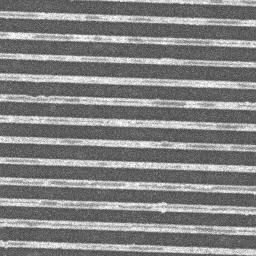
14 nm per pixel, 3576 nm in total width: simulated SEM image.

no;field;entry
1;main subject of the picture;parallel lines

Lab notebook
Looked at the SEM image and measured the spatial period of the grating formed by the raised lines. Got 291 nm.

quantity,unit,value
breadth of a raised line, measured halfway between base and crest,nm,71.6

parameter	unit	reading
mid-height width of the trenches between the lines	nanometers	211